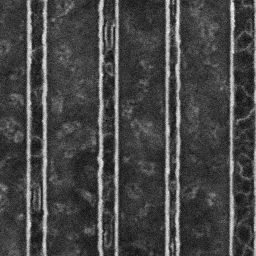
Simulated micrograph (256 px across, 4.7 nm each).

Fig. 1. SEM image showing one or a few lines or trenches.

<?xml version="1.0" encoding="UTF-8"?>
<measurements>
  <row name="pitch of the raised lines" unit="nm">319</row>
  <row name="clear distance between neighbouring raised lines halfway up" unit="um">0.247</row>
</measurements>